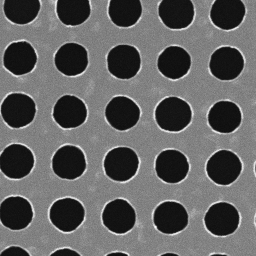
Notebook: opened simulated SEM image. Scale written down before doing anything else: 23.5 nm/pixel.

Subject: a regular array of holes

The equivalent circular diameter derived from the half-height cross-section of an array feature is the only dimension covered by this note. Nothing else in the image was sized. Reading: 803 nm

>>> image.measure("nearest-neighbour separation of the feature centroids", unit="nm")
1190